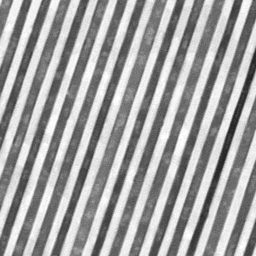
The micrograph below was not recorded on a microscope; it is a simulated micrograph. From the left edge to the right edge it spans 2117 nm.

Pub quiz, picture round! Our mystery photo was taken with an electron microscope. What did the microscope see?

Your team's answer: parallel lines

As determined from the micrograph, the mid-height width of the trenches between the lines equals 84.3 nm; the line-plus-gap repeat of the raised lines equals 150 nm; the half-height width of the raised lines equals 7.58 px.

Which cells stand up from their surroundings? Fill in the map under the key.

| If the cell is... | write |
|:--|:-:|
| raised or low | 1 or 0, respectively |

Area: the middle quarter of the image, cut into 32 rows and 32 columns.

01100011000110011000010001100011
11000110001100011000110001100110
11000110001100011000110011000110
11000110001100110000100011000110
10001110011000110001100010001100
10001100011000110001100110001100
10001100111001100001000110001100
00001000110001100011000110011000
00011000110011100011001100011000
00011000110011000110001100011000
00110001100011000110001100111001
00110001100111000110011000110001
00110001100110000100011000110001
01100011000110001100011001110011
01100011001110001100110001100011
11100011001100001000110001100011
11000110001100011000110011100111
11000110011100011001100011000110
11000110011000010001100011000110
10001100011000110001100110001100
10001100111000110011000110001100
10001100110001100011000110001100
00011000110001100111001100011100
00011001100001100110001100011000
00110001100011000110001100011001
00110001100011001110011000111001
00110011000011001100011000110001
01100011000110001100011000110011
01100011000110011000110001110011
01100110000110011000110001100011
11000110001100011000110001100110
11000110001100110001100011100110